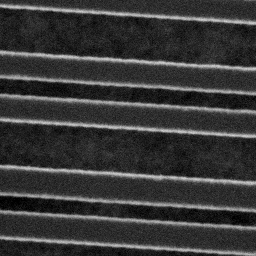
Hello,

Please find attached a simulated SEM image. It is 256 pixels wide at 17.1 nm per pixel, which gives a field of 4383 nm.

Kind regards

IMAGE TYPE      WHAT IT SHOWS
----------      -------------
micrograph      lines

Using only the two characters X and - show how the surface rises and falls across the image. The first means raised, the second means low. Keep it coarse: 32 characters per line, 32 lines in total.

XXXXXXXXXXXXXXXXXXXXXXXXXXXXXXXX
----------XXXXXXXXXXXXXXXXXXXXXX
--------------------------XXXXXX
--------------------------------
--------------------------------
--------------------------------
--------------------------------
XXXXXXXXXXXXXXX-----------------
XXXXXXXXXXXXXXXXXXXXXXXXXXXXXX--
XXXXXXXXXXXXXXXXXXXXXXXXXXXXXXXX
-------------XXXXXXXXXXXXXXXXXXX
----------------------------XXXX
XXXXXXXXXX----------------------
XXXXXXXXXXXXXXXXXXXXXXXXXX------
XXXXXXXXXXXXXXXXXXXXXXXXXXXXXXXX
-------XXXXXXXXXXXXXXXXXXXXXXXXX
-----------------------XXXXXXXXX
--------------------------------
--------------------------------
--------------------------------
--------------------------------
XXXXXXXXXXX---------------------
XXXXXXXXXXXXXXXXXXXXXXXXXX------
XXXXXXXXXXXXXXXXXXXXXXXXXXXXXXXX
--XXXXXXXXXXXXXXXXXXXXXXXXXXXXXX
------------------XXXXXXXXXXXXXX
X-------------------------------
XXXXXXXXXXXXXXXXXX--------------
XXXXXXXXXXXXXXXXXXXXXXXXXXXXXXXX
XXXXXXXXXXXXXXXXXXXXXXXXXXXXXXXX
-----------XXXXXXXXXXXXXXXXXXXXX
--------------------------XXXXXX